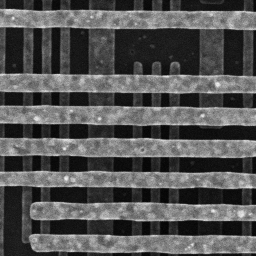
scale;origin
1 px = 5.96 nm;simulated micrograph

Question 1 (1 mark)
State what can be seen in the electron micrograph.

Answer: wiring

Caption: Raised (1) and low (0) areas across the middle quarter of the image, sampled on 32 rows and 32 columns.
00000000000000000000000000000000
00000000000000000000000000000000
00000000000000000000000000000000
11111111111111111111111111111111
11111111111111111111111111111111
11111111111111111111111111111111
11111111111111111111111111111111
00000000000000000000000000000000
00000000000000000000000000000000
00000000000000000000000000000000
00000000000000000000000000000000
11111111111111111111111111111111
11111111111111111111111111111111
11111111111111111111111111111111
11111111111111111111111111111111
00000000000000000000000000000000
00000000000000000000000000000000
00000000000000000000000000000000
00000000000000000000000000000000
11111111111111111111111111111111
11111111111111111111111111111111
11111111111111111111111111111111
11111111111111111111111111111111
00000000000000000000000000000000
00000000000000000000000000000000
00000000000000000000000000000000
00000000000000000000000000000000
11111111111111111111111111111111
11111111111111111111111111111111
11111111111111111111111111111111
11111111111111111111111111111111
00000000000000000000000000000000